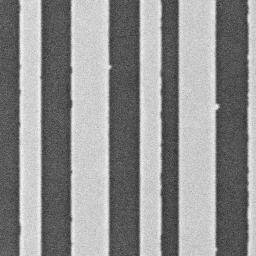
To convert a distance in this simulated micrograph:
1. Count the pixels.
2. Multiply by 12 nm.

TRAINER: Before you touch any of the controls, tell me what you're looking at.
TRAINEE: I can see lines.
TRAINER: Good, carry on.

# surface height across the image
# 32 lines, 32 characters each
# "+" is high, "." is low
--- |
...++....++++.....++..+++++....+
...++....++++.....++..+++++....+
...++....++++.....++..+++++....+
...++....++++.....++..+++++....+
...++....++++.....++..+++++....+
...++....++++.....++..+++++....+
...++....++++.....++..+++++....+
...++....++++.....++..+++++....+
...++....++++.....++..+++++....+
...++....++++.....++..+++++....+
...++....++++.....++..+++++....+
...++....++++.....++..+++++....+
...++....++++.....++..+++++....+
...++....++++.....++..+++++....+
...++....++++.....++..+++++....+
...++....++++.....++..+++++....+
...++....++++.....++..+++++....+
...++....++++.....++..+++++....+
...++....++++.....++..+++++....+
...++....++++.....++..+++++....+
...++....++++.....++..+++++....+
...++....++++.....++..+++++....+
...++....++++.....++..+++++....+
...++....++++.....++..+++++....+
...++....++++.....++..+++++....+
...++....++++.....++..+++++....+
...++....++++.....++..+++++....+
...++....++++.....++..+++++....+
...++....++++.....++..+++++....+
...++....++++.....++..+++++....+
...++....++++.....++..+++++....+
...++....++++.....++..+++++....+